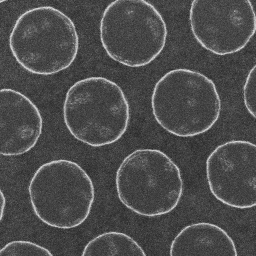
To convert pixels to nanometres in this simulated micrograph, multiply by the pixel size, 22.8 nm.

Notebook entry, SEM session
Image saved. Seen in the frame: raised bodies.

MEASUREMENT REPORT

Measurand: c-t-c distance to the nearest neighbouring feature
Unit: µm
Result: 2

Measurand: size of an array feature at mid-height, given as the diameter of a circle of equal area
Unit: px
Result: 66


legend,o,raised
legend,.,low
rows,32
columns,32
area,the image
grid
..............oooo......ooooooo.
....ooo......ooooooo....oooooooo
..ooooooo....ooooooo....oooooooo
..ooooooo....oooooooo...oooooooo
.ooooooooo...oooooooo...ooooooo.
.ooooooooo...ooooooo.....oooooo.
..oooooooo...ooooooo.......oo...
..ooooooo.....ooooo.............
...ooooo........................
.....................oooo......o
..........oooo......ooooooo....o
oo.......oooooo....oooooooo....o
oooo....oooooooo...oooooooo....o
oooo....oooooooo...oooooooo....o
ooooo...oooooooo...oooooooo.....
ooooo...oooooooo....ooooooo.....
ooooo....oooooo......oooo.......
ooooo.....oooo..................
oooo.......................ooooo
................ooooo.....oooooo
......ooo......ooooooo....oooooo
.....oooooo....ooooooo....oooooo
....ooooooo....oooooooo...oooooo
....oooooooo...oooooooo...oooooo
....oooooooo...ooooooo.....ooooo
....ooooooo.....oooooo.......ooo
.....oooooo......oooo...........
.....ooooo......................
.......................oooo.....
.............ooo......oooooo....
.ooo.......oooooo.....ooooooo...
oooooo.....ooooooo...oooooooo...